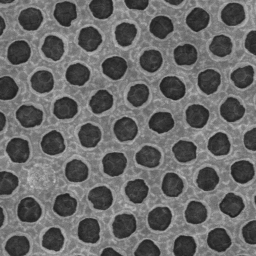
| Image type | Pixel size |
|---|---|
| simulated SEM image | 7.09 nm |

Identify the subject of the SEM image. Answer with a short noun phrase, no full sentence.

a regular array of holes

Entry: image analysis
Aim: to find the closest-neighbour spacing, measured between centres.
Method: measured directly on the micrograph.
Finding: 250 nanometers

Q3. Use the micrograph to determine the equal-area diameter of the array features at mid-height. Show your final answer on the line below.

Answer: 0.179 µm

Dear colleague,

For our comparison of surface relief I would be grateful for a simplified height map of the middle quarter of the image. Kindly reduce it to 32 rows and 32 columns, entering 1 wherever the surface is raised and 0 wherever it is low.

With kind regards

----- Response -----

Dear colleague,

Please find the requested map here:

10000011100000001110000011111000
10000001110000001111000011111111
00000001110000011111111111111111
00000001111000111111111110000111
10000011111111111111111100000011
11101111111111110000011100000011
11111111100111110000011100000011
11111110000011110000011110000011
00111110000011100000011111000111
00011100000011110000011111111111
00001100000011111000111111111110
00001100000111111111111111111100
00011111011111111111110000011100
00111111111111100111100000011100
11111111111110000011100000001100
11110000111100000011100000011110
11100000011100000001110000011111
11100000001100000011111111111111
11100000011110000011111111111111
11110000011111000111111111110000
11110000111111111110001111100000
11111111111111111110000011100000
11111111111000011100000011100000
11001111110000001100000001100000
10000111100000001100000001111000
00000011110000001111000011111111
00000011110000001111111111111111
00000011110000111111111111001111
10000011111111111111111110000011
11001111111111110000111110000001
11111111001111100000011100000001
11111110000011100000011100000011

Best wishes